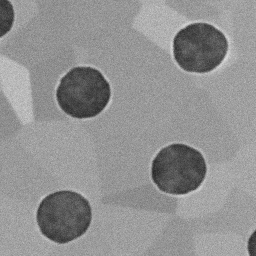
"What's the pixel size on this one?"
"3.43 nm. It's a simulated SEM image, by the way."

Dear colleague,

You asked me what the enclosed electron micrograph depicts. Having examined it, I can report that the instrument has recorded holes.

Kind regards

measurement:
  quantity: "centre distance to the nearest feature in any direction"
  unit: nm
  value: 421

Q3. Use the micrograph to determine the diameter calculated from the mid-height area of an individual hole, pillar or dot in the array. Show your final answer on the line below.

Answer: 0.185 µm